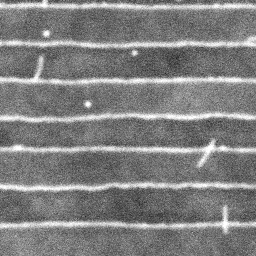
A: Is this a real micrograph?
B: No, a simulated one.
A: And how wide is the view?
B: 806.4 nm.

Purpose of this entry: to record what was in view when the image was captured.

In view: lines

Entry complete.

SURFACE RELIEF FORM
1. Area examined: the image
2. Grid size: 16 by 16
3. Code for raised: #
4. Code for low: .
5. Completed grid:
################
################
################
................
................
################
################
..##............
................
################
################
################
................
................
################
################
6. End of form